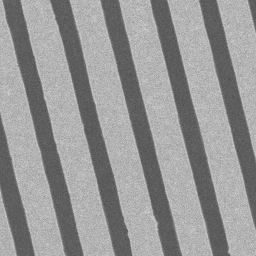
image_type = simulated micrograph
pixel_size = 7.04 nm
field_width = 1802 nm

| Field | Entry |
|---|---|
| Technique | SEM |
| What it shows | parallel lines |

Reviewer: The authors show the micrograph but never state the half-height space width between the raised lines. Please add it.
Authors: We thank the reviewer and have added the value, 116 nanometres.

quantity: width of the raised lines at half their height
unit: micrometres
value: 0.219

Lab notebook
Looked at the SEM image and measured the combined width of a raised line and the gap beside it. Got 334 nanometres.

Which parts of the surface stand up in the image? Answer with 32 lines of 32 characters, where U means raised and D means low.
DDDUUUDDDUUUUDDUUUUDDUUUUDDUUUUD
UDDUUUUDDUUUUDDUUUUDDUUUUDDUUUUD
UDDUUUUDDUUUUDDUUUUDDDUUUDDDUUUU
UDDUUUUDDDUUUDDDUUUUDDUUUUDDUUUU
UDDDUUUUDDUUUUDDUUUUDDUUUUDDUUUU
UUDDUUUUDDUUUUDDUUUUDDUUUUDDUUUU
UUDDUUUUDDUUUUDDUUUUDDDUUUUDDUUU
UUDDUUUUDDDUUUDDDUUUUDDUUUUDDUUU
UUDDDUUUUDDUUUUDDUUUUDDUUUUDDUUU
UUUDDUUUUDDUUUUDDUUUUDDUUUUDDUUU
UUUDDUUUUDDUUUUDDUUUUDDUUUUDDDUU
UUUDDUUUUDDUUUUDDDUUUUDDUUUUDDUU
UUUDDDUUUUDDUUUUDDUUUUDDUUUUDDUU
UUUUDDUUUUDDUUUUDDUUUUDDUUUUDDUU
UUUUDDUUUUDDUUUUDDUUUUDDUUUUDDDU
UUUUDDUUUUDDUUUUDDDUUUUDDUUUUDDU
DUUUDDDUUUUDDUUUUDDUUUUDDUUUUDDU
DUUUUDDUUUUDDUUUUDDUUUUDDUUUUDDU
DUUUUDDUUUUDDUUUUDDUUUUDDDUUUDDD
DUUUUDDUUUUDDDUUUDDDUUUDDDUUUUDD
DUUUUDDDUUUUDDUUUUDDUUUUDDUUUUDD
DDUUUUDDUUUUDDUUUUDDUUUUDDUUUUDD
DDUUUUDDUUUUDDUUUUDDUUUUDDDUUUDD
DDUUUUDDUUUUDDDUUUDDDUUUUDDUUUUD
DDDUUUDDDUUUUDDUUUUDDUUUUDDUUUUD
UDDUUUUDDUUUUDDUUUUDDUUUUDDUUUUD
UDDUUUUDDUUUUDDUUUUDDUUUUDDDUUUD
UDDUUUUDDUUUUDDDUUUUDDUUUUDDUUUU
UDDDUUUDDDUUUUDDUUUUDDUUUUDDUUUU
UUDDUUUUDDUUUUDDUUUUDDUUUUDDUUUU
UUDDUUUUDDUUUUDDUUUUDDUUUUDDUUUU
UUDDUUUUDDUUUUDDDUUUDDDUUUUDDUUU